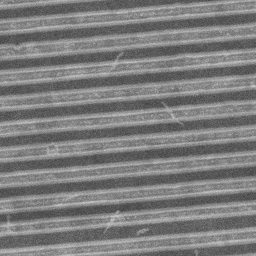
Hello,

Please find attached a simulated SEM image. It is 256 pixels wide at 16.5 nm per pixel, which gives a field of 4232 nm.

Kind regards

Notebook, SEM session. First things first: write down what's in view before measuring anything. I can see parallel lines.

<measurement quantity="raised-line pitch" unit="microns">0.419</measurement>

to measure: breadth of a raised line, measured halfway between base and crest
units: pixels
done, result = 11.6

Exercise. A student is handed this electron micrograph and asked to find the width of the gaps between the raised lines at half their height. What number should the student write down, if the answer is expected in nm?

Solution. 222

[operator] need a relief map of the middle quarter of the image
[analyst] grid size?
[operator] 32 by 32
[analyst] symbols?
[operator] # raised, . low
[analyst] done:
....############################
########################........
#############...................
#...............................
..............................##
...................#############
.......#########################
############################....
################.#..............
####............................
................................
.........................#######
.............###################
..##############################
######################..........
##########......................
................................
..............................##
.................###############
.....###########################
#########################.......
##############..................
##..............................
................................
.......................#########
...........#####################
###############################.
#################...............
########........................
................................
............................####
..............##################